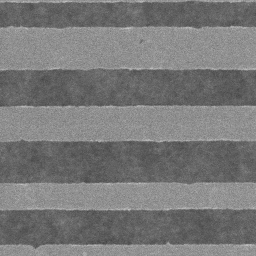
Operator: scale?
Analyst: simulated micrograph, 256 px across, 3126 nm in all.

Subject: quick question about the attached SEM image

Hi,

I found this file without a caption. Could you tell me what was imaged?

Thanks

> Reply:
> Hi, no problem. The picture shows one or a few lines or trenches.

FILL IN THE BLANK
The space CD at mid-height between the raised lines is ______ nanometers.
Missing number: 443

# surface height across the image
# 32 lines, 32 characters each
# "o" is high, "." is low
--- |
................................
................................
................................
.ooo.....ooooooooooooooo.ooooooo
oooooooooooooooooooooooooooooooo
oooooooooooooooooooooooooooooooo
oooooooooooooooooooooooooooooooo
oooooooooooooooooooooooooooooooo
oooooooooooo.ooooooooooooooooooo
................................
................................
................................
................................
oooooooooooooooooooooooooooooooo
oooooooooooooooooooooooooooooooo
oooooooooooooooooooooooooooooooo
oooooooooooooooooooooooooooooooo
oooooooooooooooooooooooooooooooo
................................
................................
................................
................................
................................
oooooooooooooooooooooooooooooooo
oooooooooooooooooooooooooooooooo
oooooooooooooooooooooooooooooooo
................................
................................
................................
................................
................................
oooooooooooooooooooooooooooooooo